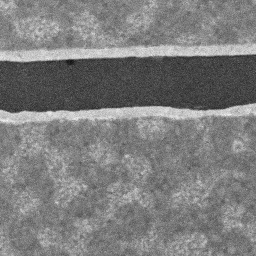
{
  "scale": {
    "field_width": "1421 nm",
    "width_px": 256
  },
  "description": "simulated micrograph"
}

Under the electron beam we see one or a few lines or trenches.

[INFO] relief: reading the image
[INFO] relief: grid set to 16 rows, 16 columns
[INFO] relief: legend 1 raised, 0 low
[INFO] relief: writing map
1111111111111111
1111111111111111
1111111111111111
1100000000000000
0000000000000000
0000000000000000
0000000000000000
1111111111111111
1111111111111111
1111111111111111
1111111111111111
1111111111111111
1111111111111111
1111111111111111
1111111111111111
1111111111111111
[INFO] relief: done